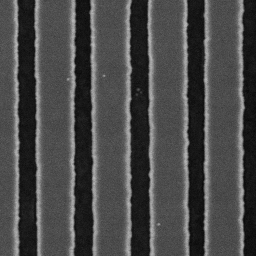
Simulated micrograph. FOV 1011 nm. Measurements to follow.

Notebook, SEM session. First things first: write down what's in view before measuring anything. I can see lines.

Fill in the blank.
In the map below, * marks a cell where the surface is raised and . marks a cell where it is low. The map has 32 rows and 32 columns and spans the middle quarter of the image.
***....**********....**********.
***....**********....**********.
***....**********....**********.
***....**********....**********.
***....**********....**********.
***....**********....**********.
***....**********....**********.
***....**********....**********.
**.....**********....**********.
***....**********....**********.
***....*********.....**********.
***....*********.....**********.
**.....**********....**********.
**.....**********....**********.
***....**********....**********.
**.....**********.....*********.
**.....*********......*********.
***....**********.....*********.
**.....**********.....*********.
***....**********.....*********.
***....**********.....*********.
***....**********....**********.
***....**********....**********.
**.....**********....**********.
**.....**********.....*********.
***....**********.....*********.
***....**********.....*********.
***....**********....**********.
***....**********....**********.
***....**********.....*********.
***....**********.....*********.
**.....**********....**********.